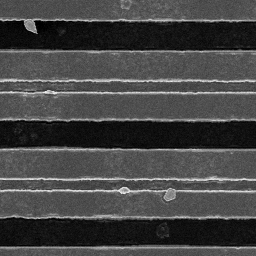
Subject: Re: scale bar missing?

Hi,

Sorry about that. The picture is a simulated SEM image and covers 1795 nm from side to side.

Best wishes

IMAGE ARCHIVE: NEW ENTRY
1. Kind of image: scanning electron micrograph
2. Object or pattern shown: lines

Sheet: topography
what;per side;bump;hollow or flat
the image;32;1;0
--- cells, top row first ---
11111111111111111111111111111111
11111111111111111111111111111111
11111111111111111111111111111111
00010000000000000000000000000000
00000000000000000000000000000000
00000000000000000000000000000000
11111111111111111111111111111111
11111111111111111111111111111111
11111111111111111111111111111111
11111111111111111111111111111111
11111111111111111111111111111111
11111111111111111111111111111111
11111111111111111111111111111111
11111111111111111111111111111111
11111111111111111111111111111111
00000000000000000000000000000000
00000000000000000000000000000000
00000000000000000000000000000000
00000000000000000000000000000000
11111111111111111111111111111111
11111111111111111111111111111111
11111111111111111111111111111111
11111111111111111111111111111111
11111111111111111111111111111111
11111111111111111111111111111111
11111111111111111111111111111111
11111111111111111111111111111111
00000000000000000000000000000000
00000000000000000000000000000000
00000000000000000000000000000000
00000000000000000000000000000000
11111111111111111111111111111111